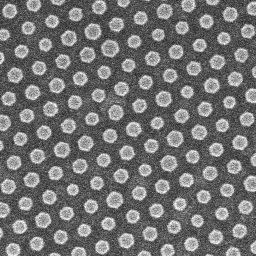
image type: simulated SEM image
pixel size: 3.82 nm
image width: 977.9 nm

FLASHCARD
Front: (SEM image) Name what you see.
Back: a regular array of raised bodies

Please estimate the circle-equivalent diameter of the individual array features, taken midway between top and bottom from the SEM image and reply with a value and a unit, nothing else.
50.8 nm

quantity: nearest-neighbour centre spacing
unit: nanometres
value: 91.8